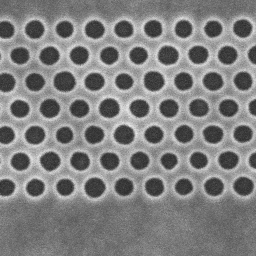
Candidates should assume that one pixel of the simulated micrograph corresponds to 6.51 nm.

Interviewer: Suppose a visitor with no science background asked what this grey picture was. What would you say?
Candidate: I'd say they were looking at a regular array of holes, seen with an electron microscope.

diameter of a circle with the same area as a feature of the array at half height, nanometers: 127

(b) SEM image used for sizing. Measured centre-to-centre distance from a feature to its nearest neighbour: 192 nm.